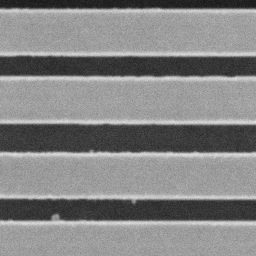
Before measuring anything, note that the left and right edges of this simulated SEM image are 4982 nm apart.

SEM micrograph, lines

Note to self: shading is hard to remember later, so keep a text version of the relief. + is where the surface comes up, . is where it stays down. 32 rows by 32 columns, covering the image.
................................
++++++++++++++++++++++++++++++++
++++++++++++++++++++++++++++++++
++++++++++++++++++++++++++++++++
++++++++++++++++++++++++++++++++
++++++++++++++++++++++++++++++++
++++++++++++++++++++++++++++++++
................................
................................
................................
++++++++++++++++++++++++++++++++
++++++++++++++++++++++++++++++++
++++++++++++++++++++++++++++++++
++++++++++++++++++++++++++++++++
++++++++++++++++++++++++++++++++
................................
................................
................................
................................
++++++++++++++++++++++++++++++++
++++++++++++++++++++++++++++++++
++++++++++++++++++++++++++++++++
++++++++++++++++++++++++++++++++
++++++++++++++++++++++++++++++++
++++++++++++++++++++++++++++++++
................................
................................
................................
++++++++++++++++++++++++++++++++
++++++++++++++++++++++++++++++++
++++++++++++++++++++++++++++++++
++++++++++++++++++++++++++++++++